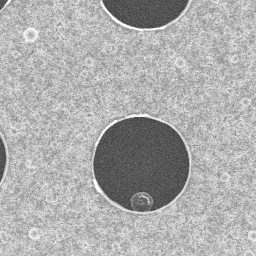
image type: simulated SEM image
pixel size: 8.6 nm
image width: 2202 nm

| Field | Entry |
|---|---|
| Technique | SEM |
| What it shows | holes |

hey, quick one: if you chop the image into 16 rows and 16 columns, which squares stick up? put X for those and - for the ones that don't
XXXXXXX-----XXXX
XXXXXXXX--XXXXXX
XXXXXXXXXXXXXXXX
XXXXXXXXXXXXXXXX
XXXXXXXXXXXXXXXX
XXXXXXXXXXXXXXXX
XXXXXXXXXXXXXXXX
XXXXXXXX--XXXXXX
XXXXXX-----XXXXX
XXXXXX------XXXX
XXXXXX------XXXX
XXXXXX------XXXX
XXXXXXX----XXXXX
XXXXXXXXXXXXXXXX
XXXXXXXXXXXXXXXX
XXXXXXXXXXXXXXXX